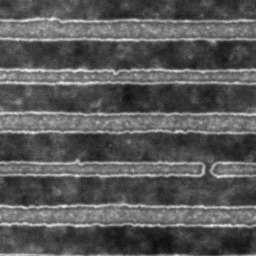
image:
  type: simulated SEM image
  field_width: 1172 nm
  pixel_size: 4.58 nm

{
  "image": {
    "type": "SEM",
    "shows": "parallel lines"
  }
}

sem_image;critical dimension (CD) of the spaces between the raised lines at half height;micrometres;0.0762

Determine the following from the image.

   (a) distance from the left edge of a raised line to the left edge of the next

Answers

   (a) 208 nm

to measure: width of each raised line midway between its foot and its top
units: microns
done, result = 0.148